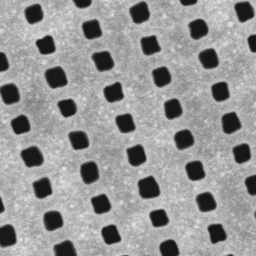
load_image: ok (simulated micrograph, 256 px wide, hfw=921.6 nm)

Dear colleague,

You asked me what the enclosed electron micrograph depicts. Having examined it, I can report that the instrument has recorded a regular array of holes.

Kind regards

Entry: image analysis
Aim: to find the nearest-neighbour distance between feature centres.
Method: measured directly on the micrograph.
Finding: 120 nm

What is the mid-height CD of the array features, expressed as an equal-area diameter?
65.7 nanometres